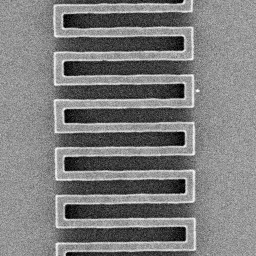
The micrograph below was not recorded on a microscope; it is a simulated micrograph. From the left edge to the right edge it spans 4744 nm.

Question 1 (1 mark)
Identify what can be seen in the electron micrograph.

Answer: groups of lines, slits or small figures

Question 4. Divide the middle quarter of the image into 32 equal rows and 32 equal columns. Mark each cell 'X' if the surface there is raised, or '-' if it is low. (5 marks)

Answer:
--------------------------------
--------------------------------
--------------------------------
XXXXXXXXXXXXXXXXXXXXXXXXXXXXXXXX
XXXXXXXXXXXXXXXXXXXXXXXXXXXXXXXX
------------------------------XX
------------------------------XX
------------------------------XX
------------------------------XX
XXXXXXXXXXXXXXXXXXXXXXXXXXXXXXXX
XXXXXXXXXXXXXXXXXXXXXXXXXXXXXXXX
--------------------------------
--------------------------------
--------------------------------
--------------------------------
XXXXXXXXXXXXXXXXXXXXXXXXXXXXXXXX
XXXXXXXXXXXXXXXXXXXXXXXXXXXXXXXX
------------------------------XX
-------------------------------X
-------------------------------X
------------------------------XX
XXXXXXXXXXXXXXXXXXXXXXXXXXXXXXXX
XXXXXXXXXXXXXXXXXXXXXXXXXXXXXXXX
--------------------------------
--------------------------------
--------------------------------
--------------------------------
XXXXXXXXXXXXXXXXXXXXXXXXXXXXXXXX
XXXXXXXXXXXXXXXXXXXXXXXXXXXXXXXX
-------------------------------X
-------------------------------X
-------------------------------X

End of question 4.